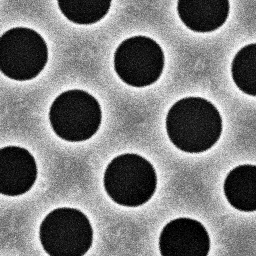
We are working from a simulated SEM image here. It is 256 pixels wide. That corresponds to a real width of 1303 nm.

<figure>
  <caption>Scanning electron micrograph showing holes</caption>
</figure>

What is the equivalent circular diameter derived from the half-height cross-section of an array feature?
274 nanometres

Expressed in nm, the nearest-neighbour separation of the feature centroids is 427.